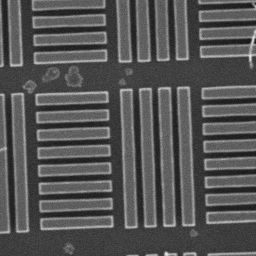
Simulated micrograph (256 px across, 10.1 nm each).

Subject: groups of lines, slits or small figures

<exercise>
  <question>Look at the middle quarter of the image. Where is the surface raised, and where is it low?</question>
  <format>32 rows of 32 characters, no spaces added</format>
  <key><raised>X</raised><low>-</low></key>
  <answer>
--------------------------------
--------------------------------
--------------------------------
--------------------------------
--------------------------------
--------------------------------
---------------XX--XXX--XXX--XX-
-XXXXXXXXXX---XXX--XXX--XXX--XX-
XXXXXXXXXXX---XXX--XXX--XXX--XX-
XXXXXXXXX-----XXX--XXX--XXX--XX-
--------------XXX--XXX--XXX--XX-
--------------XXX--XXX--XXX--XX-
XXXXXXXXXXX---XXX--XXX--XXX--XXX
XXXXXXXXXXX----XX--XXX--XXX--XXX
---------------XX--XXX--XXX--XXX
---------------XX--XXX--XXX--XXX
XXXXXXXXXXX----XX--XXX--XXX--XXX
XXXXXXXXXXX----XX--XXX--XXX--XXX
XXXXXXXXX------XX---XX--XXX--XXX
---------------XX---XX--XXX--XXX
----------X----XX---XX--XXX--XXX
XXXXXXXXXXX----XXX--XX--XXX--XXX
XXXXXXXXXXX----XXX--XX--XXX--XXX
---------------XXX--XX--XXX--XXX
---------------XXX--XX--XXX--XXX
XXXXXXXXXXX----XXX--XX--XXX--XXX
XXXXXXXXXXX----XXX--XXX-XXX--XXX
XXXXXX---------XXX--XXX-XXX--XXX
---------------XXX--XXX-XXX--XXX
---------XX----XXX--XXX-XXX--XXX
XXXXXXXXXXXX---XXX--XXX--XX--XXX
XXXXXXXXXXXX---XXX--XXX--XX--XXX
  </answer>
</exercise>